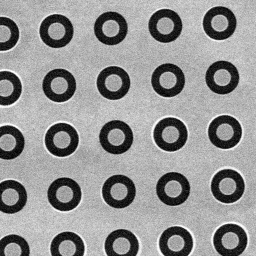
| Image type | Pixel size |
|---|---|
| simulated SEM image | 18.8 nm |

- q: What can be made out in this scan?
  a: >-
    an array of small figures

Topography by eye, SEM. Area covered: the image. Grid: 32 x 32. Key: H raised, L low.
HHHHHHHHHHHHHHHHHHHHHHHHHHHHHHHH
HHHHHHHHHHHHHLHHHHHLLLHHHHLLLHHH
LLHHHLLLLHHHLLLLHHHLLLLHHLLLLLHH
LLHHHLLLLHHHLLLLHHHLLLLHHLLLLHHH
LLHHHLLLLHHHLLLLHHHLLLHHHHLLLHHH
LLHHHHLLHHHHHLLHHHHHHHHHHHHHHHHH
HHHHHHHHHHHHHHHHHHHHHHHHHHHHHHHH
HHHHHHHHHHHHHHHHHHHHHHHHHHHHHHHH
HHHHHHHHHHHHHLLHHHHHLLHHHHLLLLHH
LLHHHHLLLHHHLLLLHHHLLLLHHHLLLLHH
LLLHHLLLLLHHLLLLHHHLLLLHHHLLLLHH
LLLHHLLLLHHHLLLLHHHLLLLHHHHLLHHH
LLHHHHLLLHHHHHHHHHHHHHHHHHHHHHHH
HHHHHHHHHHHHHHHHHHHHHHHHHHHHHHHH
HHHHHHHHHHHHHHHHHHHHHHHHHHHLLHHH
HHHHHHHLLHHHHLLLHHHLLLLHHHLLLLHH
LLLHHHLLLLHHLLLLLHHLLLLHHHLLLLHH
LLLHHLLLLLHHLLLLLHHLLLLHHHLLLLHH
LLLHHHLLLLHHHLLLHHHHLLLHHHHLLHHH
LLHHHHHLLHHHHHHHHHHHHHHHHHHHHHHH
HHHHHHHHHHHHHHHHHHHHHHHHHHHHHHHH
HHHHHHHHHHHHHHHHHHHHHHHHHHHLLLHH
HLHHHHHLLHHHHLLLHHHHLLLHHHLLLLLH
LLLHHHLLLLHHHLLLLHHLLLLLHHLLLLLH
LLLHHHLLLLHHHLLLLHHHLLLLHHHLLLHH
LLLHHHLLLLHHHLLLHHHHHLLHHHHHHHHH
LLHHHHHHHHHHHHHHHHHHHHHHHHHHHHHH
HHHHHHHHHHHHHHHHHHHHHHHHHHHHHHHH
HHHHHHHHHHHHHHHHHHHHHLLHHHHLLLHH
HLHHHHHLLLHHHLLLLHHHLLLLHHHLLLLH
LLLLHHLLLLLHHLLLLHHHLLLLHHHLLLLH
LLLLHHLLLLLHHLLLLHHHLLLLHHHLLLHH